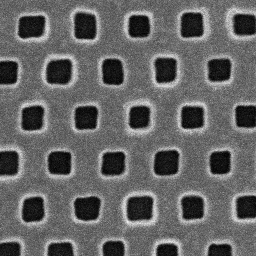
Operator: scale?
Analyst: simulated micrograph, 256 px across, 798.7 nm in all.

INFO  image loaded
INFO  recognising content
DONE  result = a regular array of holes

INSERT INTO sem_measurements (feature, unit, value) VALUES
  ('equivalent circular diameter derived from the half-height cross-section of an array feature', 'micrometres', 0.0837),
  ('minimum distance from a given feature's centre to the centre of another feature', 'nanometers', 162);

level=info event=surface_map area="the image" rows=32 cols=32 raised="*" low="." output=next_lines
********************************
**********.*********************
**....***...****...****..****...
**....***...****...***....***...
**...****...****..*****..*****.*
********************************
********************************
******...****..****...****...***
..****...****...***...****...***
..****...****...***...****...***
..****...****..*****************
********************************
********************************
***..*****..****...****..*****..
***...***...****...****...***...
**....***...****...****...****..
********************************
********************************
********************************
..****...****...***...****...***
..****...****...***...****...***
..****...****...***...****...***
********************************
********************************
****************...****..*****..
***...***....***...****...***...
***...***....***...****...***...
***..*****..****...****.********
********************************
********************************
...***...****...****..**********
...***...****...***...****...***